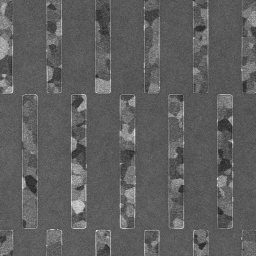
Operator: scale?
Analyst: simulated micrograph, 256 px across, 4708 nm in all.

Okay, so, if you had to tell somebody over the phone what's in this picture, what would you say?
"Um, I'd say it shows groups of lines, slits or small figures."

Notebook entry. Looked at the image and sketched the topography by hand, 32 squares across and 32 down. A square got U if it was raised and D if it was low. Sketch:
UUDDDDUUDDDDUUDDDDUUDDDDUUDDDDUU
UUDDDDUUDDDDUUDDDDUUDDDDUUDDDDUU
UUDDDDUUDDDDUUDDDDUUDDDDUUDDDDUU
UUDDDDUUDDDDUUDDDDUUDDDDUUDDDDUU
UUDDDDUUDDDDUUDDDDUUDDDDUUDDDDUU
UUDDDDUUDDDDUUDDDDUUDDDDUUDDDDUU
UDDDDDUUDDDDUUDDDDUUDDDDUUDDDDUU
UDDDDDUUDDDDUUDDDDUUDDDDUUDDDDUU
UDDDDDUUDDDDUUDDDDUUDDDDUUDDDDUU
UDDDDDUUDDDDUUDDDDUUDDDDUUDDDDUU
UUDDDDUUDDDDUUDDDDUUDDDDUUDDDDUU
UDDDDDUDDDDDUDDDDDUUDDDDUUDDDDDU
DDDUUDDDDUUDDDDUUDDDDUUDDDDUUDDD
DDDUUDDDDUUDDDDUUDDDDUUDDDDUUDDD
DDDUUDDDDUUDDDDUUDDDDUUDDDDUUDDD
DDDUUDDDDUUDDDDUUDDDDUUDDDDUUDDD
DDDUUDDDDUUDDDDUUDDDDUUDDDDUUDDD
DDDUUDDDDUUDDDDUUDDDDUUDDDDUUDDD
DDDUUDDDDUUDDDDUUDDDDUUDDDDUUDDD
DDDUUDDDDUUDDDDUUDDDDUUDDDDUUDDD
DDDUUDDDDUUDDDDUUDDDDUUDDDDUUDDD
DDDUUDDDDUUDDDDUUDDDDUUDDDDUUDDD
DDDUUDDDDUUDDDDUUDDDDUUDDDDUUDDD
DDDUUDDDDUUDDDDUUDDDDUUDDDDUUDDD
DDDUUDDDDUUDDDDUUDDDDUUDDDDUUDDD
DDDUUDDDDUUDDDDUUDDDDUUDDDDUUDDD
DDDUUDDDDUUDDDDUUDDDDUUDDDDUUDDD
DDDUUDDDDUUDDDDUUDDDDUUDDDDUUDDD
DDDDDDDDDDDDDDDDDDDDDDDDDDDDDDDD
UUDDDDUUDDDDUUDDDDUUDDDDUUDDDDUU
UUDDDDUUDDDDUUDDDDUUDDDDUUDDDDUU
UUDDDDUUDDDDUUDDDDUUDDDDUUDDDDUU